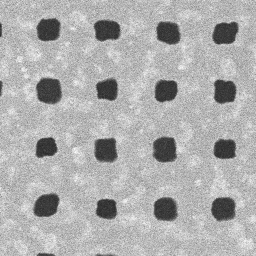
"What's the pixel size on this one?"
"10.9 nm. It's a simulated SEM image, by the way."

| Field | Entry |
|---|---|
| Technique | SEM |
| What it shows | a regular array of holes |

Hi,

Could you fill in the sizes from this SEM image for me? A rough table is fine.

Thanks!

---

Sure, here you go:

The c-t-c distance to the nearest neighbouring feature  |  634 nanometres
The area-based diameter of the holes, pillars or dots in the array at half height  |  0.257 micrometres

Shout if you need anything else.